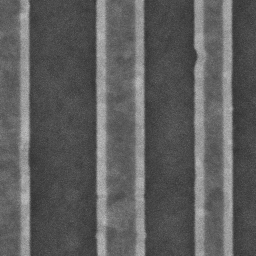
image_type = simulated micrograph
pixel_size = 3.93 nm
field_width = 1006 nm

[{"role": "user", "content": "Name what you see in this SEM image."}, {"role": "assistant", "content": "one or a few lines or trenches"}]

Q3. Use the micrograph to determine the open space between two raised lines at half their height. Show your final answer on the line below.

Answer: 267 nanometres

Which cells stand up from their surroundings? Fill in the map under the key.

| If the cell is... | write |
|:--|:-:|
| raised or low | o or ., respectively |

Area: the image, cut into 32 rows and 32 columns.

ooo..........oooo........ooo....
ooo..........oooo........ooo....
ooo..........oooo........ooo....
ooo..........oooo........ooo....
ooo..........oooo........ooo....
ooo..........oooo........ooo....
ooo..........oooo........ooo....
ooo..........oooo........ooo....
ooo..........oooo........ooo....
ooo..........oooo........ooo....
ooo..........oooo........ooo....
ooo..........oooo........ooo....
ooo..........oooo........ooo....
ooo..........oooo........ooo....
ooo..........oooo........ooo....
ooo..........oooo........oooo...
ooo..........oooo........ooo....
ooo..........oooo........oooo...
ooo..........oooo........oooo...
ooo..........oooo........oooo...
ooo..........oooo........oooo...
ooo..........oooo........oooo...
ooo..........ooooo.......oooo...
ooo..........ooooo.......oooo...
ooo..........ooooo.......oooo...
ooo..........ooooo.......oooo...
ooo..........ooooo.......oooo...
ooo..........ooooo.......oooo...
ooo..........ooooo.......ooo....
ooo..........ooooo.......ooo....
ooo..........ooooo.......oooo...
ooo..........ooooo.......oooo...